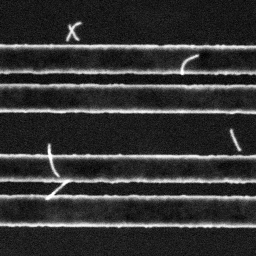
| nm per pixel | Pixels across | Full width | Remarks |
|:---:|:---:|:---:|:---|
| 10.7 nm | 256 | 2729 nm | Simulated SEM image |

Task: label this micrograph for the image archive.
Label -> lines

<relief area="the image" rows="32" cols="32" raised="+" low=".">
................................
................................
................................
................................
................................
................................
++++++++++++++++++++++++++++++++
++++++++++++++++++++++++++++++++
++++++++++++++++++++++++++++++++
................................
................................
++++++++++++++++++++++++++++++++
++++++++++++++++++++++++++++++++
++++++++++++++++++++++++++++++++
................................
................................
................................
................................
................................
++++++++++++++++++++++.+........
++++++++++++++++++++++++++++++++
++++++++++++++++++++++++++++++++
++++++++++++++++++++++++++++++++
................................
+.+++.++........................
++++++++++++++++++++++++++++++++
++++++++++++++++++++++++++++++++
++++++++++++++++++++++++++++++++
................................
................................
................................
................................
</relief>